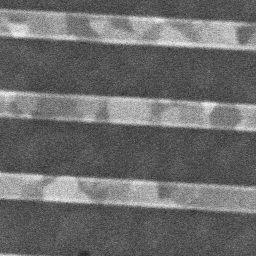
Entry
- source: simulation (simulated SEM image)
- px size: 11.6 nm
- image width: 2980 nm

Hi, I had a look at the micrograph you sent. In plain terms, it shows one or a few lines or trenches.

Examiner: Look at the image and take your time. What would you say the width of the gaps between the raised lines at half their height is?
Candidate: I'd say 59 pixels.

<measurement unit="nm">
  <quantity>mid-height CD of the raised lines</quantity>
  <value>269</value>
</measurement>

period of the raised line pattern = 948 nm